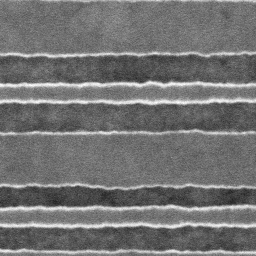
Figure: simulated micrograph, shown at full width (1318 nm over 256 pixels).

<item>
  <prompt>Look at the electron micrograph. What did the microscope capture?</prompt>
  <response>lines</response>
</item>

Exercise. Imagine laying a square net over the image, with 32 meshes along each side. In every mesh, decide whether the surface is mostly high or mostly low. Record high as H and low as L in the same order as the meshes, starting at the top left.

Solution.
HHHHHHHHHHHHHHHHHHHHHHHHHHHHHHHH
HHHHHHHHHHHHHHHHHHHHHHHHHHHHHHHH
HHHHHHHHHHHHHHHHHHHHHHHHHHHHHHHH
HHHHHHHHHHHHHHHHHHHHHHHHHHHHHHHH
HHHHHHHHHHHHHHHHHHHHHHHHHHHHHHHH
HHHHHHHHHHHHHHHHHHHHHHHHHHHHHHHH
HHHHHHHHHHHHHHHHHHHHHHHHHHHHHHHH
LLLLLLLLLLLLLLLLLLLLLLLLLLLLLLLL
LLLLLLLLLLLLLLLLLLLLLLLLLLLLLLLL
LLLLLLLLLLLLLLLLLLLLLLLLLLLLLLLL
LLLHLLLLLLHHHLHHHLHHHHHHHHHLLLLL
HHHHHHHHHHHHHHHHHHHHHHHHHHHHHHHH
HHHHHHHHHHHHHHHHHHHHHHHHHHHHHHHH
LLLLLLLLLLLLLLLLLLLLLLLLLLLLLLLL
LLLLLLLLLLLLLLLLLLLLLLLLLLLLLLLL
LLLLLLLLLLLLLLLLLLLLLLLLLLLLLLLL
LLLLHLLLLLLLHLHHHHHLHHHHHHLLLLLH
HHHHHHHHHHHHHHHHHHHHHHHHHHHHHHHH
HHHHHHHHHHHHHHHHHHHHHHHHHHHHHHHH
HHHHHHHHHHHHHHHHHHHHHHHHHHHHHHHH
HHHHHHHHHHHHHHHHHHHHHHHHHHHHHHHH
HHHHHHHHHHHHHHHHHHHHHHHHHHHHHHHH
HHHHHHHHHHHHHHHHHHHHHHHHHHHHHHHH
LLLLLLLLLLLLLHHHHLLLLLLLLLLLLHLH
LLLLLLLLLLLLLLLLLLLLLLLLLLLLLLLL
LLLLLLLLLLLLLLLLLLLLLLLLLLLLLLLL
HHHHHHHHHHHHHHHHHHHHHHHHHHHHHHHH
HHHHHHHHHHHHHHHHHHHHHHHHHHHHHHHH
LLLLLLLLLLLLLLLLLLLLLLLLLLLLLLLL
LLLLLLLLLLLLLLLLLLLLLLLLLLLLLLLL
LLLLLLLLLLLLLLLLLLLLLLLLLLLLLLLL
HHHHHHHHLLHHHLHHHHHHHHHHLLHHLLLL